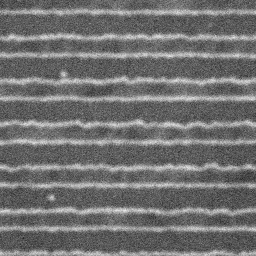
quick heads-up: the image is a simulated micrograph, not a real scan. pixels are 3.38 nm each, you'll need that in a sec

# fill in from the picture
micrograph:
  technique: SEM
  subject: lines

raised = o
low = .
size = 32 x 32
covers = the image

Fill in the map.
oooooooooooooooooooooooooooooooo
oooooooooo.ooooooooooooooooooooo
................................
................................
.o....oooo...oo..o.o.oo..o......
oooooooooooooooooooooooooooooooo
oooooooooooooooooooooooooooooooo
................................
................................
................................
oooooooooooooooooooooooooooooooo
oooooooooooooooooooooooooooooooo
................................
................................
................................
oooooooooo.ooo.ooo.ooo..o..ooooo
oooooooooooooooooooooooooooooooo
oooooooooooooooooooooooooooooooo
................................
................................
................................
oooooooooooooooooooooooooooooooo
oooooooooooooooooooooooooooooooo
................................
................................
................................
oooooooooooooooooooooooooooooooo
oooooooooooooooooooooooooooooooo
oooooooooooooooooooooooooooooooo
................................
................................
................................